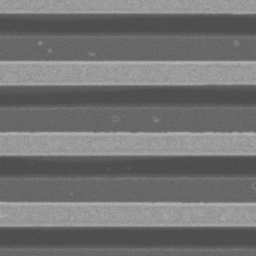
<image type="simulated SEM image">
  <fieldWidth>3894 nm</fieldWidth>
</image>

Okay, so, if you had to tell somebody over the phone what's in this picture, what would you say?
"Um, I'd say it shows lines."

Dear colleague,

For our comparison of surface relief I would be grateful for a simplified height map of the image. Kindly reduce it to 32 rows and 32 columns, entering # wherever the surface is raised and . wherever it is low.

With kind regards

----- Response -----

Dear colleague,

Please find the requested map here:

################################
################################
................................
................................
................................
################################
################################
################################
################################
################################
################################
................................
................................
################################
################################
################################
################################
################################
################################
................................
................................
................................
################################
################################
################################
################################
################################
################################
................................
................................
................................
################################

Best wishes